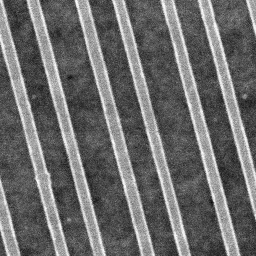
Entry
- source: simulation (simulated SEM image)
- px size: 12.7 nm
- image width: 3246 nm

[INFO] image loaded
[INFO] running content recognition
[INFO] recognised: parallel lines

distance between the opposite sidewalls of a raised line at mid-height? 0.138 µm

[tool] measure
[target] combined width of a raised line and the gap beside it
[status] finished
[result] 519 nm